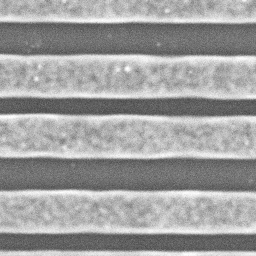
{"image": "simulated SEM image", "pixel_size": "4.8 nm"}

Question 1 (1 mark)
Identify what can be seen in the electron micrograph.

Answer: wiring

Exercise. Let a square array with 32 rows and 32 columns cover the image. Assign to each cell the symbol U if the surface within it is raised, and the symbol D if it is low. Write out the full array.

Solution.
UUUUUUUUUUUUUUUUUUUUUUUUUUUUUUUU
UUUUUUUUUUUUUUUUUUUUUUUUUUUUUUUU
UUUUUUUUUUUUUUUUUUUUUUUUUUUUUUUU
DDDDDDDDDDDDDDDDDDDDDDDDDDDDDDDD
DDDDDDDDDDDDDDDDDDDDDDDDDDDDDDDD
DDDDDDDDDDDDDDDDDDDDDDDDDDDDDDDD
DDDDDDDDDDDDDDDDDDDDDDDDDDDDDDDD
UUUUUUUUUUUUUUUUUUUUUUUUUUUUUUUU
UUUUUUUUUUUUUUUUUUUUUUUUUUUUUUUU
UUUUUUUUUUUUUUUUUUUUUUUUUUUUUUUU
UUUUUUUUUUUUUUUUUUUUUUUUUUUUUUUU
UUUUUUUUUUUUUUUUUUUUUUUUUUUUUUUU
DDDDDDDDDDDDDDDDDDDDDDDDDDDDDDDD
DDDDDDDDDDDDDDDDDDDDDDDDDDDDDDDD
UUUUUUUUDDDDDDUUUDDDDDDDDDDDDDDD
UUUUUUUUUUUUUUUUUUUUUUUUUUUUUUUU
UUUUUUUUUUUUUUUUUUUUUUUUUUUUUUUU
UUUUUUUUUUUUUUUUUUUUUUUUUUUUUUUU
UUUUUUUUUUUUUUUUUUUUUUUUUUUUUUUU
DUUUDDDUUUUUUUUUUUUUUDDDUUUUUUUU
DDDDDDDDDDDDDDDDDDDDDDDDDDDDDDDD
DDDDDDDDDDDDDDDDDDDDDDDDDDDDDDDD
DDDDDDDDDDDDDDDDDDDDDDDDDDDDDDDD
DDDDDDDDDDDDDDDDDDDDDDDDDDDDDDDD
UUUUUUUUUUUUUUUUUUUUUUUUUUUUUUUU
UUUUUUUUUUUUUUUUUUUUUUUUUUUUUUUU
UUUUUUUUUUUUUUUUUUUUUUUUUUUUUUUU
UUUUUUUUUUUUUUUUUUUUUUUUUUUUUUUU
UUUUUUUUUUUUUUUUUUUUUUUUUUUUUUUU
DDDDDDDDDDDDDDDDDDDDDDDDDDDDDDDD
DDDDDDDDDDDDDDDDDDDDDDDDDDDDDDDD
DDDDUUUUDDDDDDDDDDDDDDDDDDDDDDDD